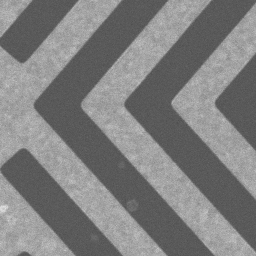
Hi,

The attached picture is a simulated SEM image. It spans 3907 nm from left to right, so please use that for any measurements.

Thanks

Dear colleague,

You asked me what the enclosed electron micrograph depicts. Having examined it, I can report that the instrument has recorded groups of lines, slits or small figures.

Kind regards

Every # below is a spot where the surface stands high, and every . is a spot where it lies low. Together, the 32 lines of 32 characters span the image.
####......#####......#####......
###......#####......#####......#
##......#####......#####......##
#......#####......#####......###
......#####......######......###
.....#####......######......####
#...######......#####......#####
##..#####......#####......#####.
########......#####......#####..
#######......#####......#####...
######......#####......######...
#####......#####.......#####....
####......######......#####.....
####......######......#####.....
#####......#####.......#####....
######......#####.......#####...
#######......#####......######..
########......#####......######.
#########......#####......######
#...######......#####......#####
.....#####.......#####......####
......#####......######......###
#......#####......######......##
##......#####......######......#
###......#####......######......
####......#####.#....#####......
####.......#####......#####.....
#####......######......#####....
######......######......#####...
#######......######......#####..
########......#####.......#####.
#########......#####.......#####